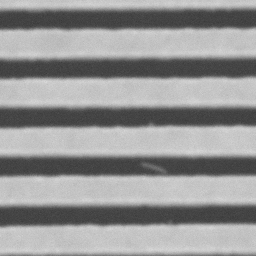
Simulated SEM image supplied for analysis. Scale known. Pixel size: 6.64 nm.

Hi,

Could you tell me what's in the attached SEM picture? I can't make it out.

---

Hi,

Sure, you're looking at lines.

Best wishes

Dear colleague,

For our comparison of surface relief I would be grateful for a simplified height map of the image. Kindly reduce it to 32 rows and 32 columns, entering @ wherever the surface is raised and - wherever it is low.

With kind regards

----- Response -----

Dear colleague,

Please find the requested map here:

@@@@@@@@@@@@@@@@@@@@@@@@@@@@@@@@
--------------------------------
--------------------------------
--------------------------------
@@@@@@@@@@@@@@@@@@@@@@@@@@@@@@@@
@@@@@@@@@@@@@@@@@@@@@@@@@@@@@@@@
@@@@@@@@@@@@@@@@@@@@@@@@@@@@@@@@
--------------------------------
--------------------------------
--------------------------------
@@@@@@@@@@@@@@@@@@@@@@@@@@@@@@@@
@@@@@@@@@@@@@@@@@@@@@@@@@@@@@@@@
@@@@@@@@@@@@@@@@@@@@@@@@@@@@@@@@
--------------------------------
--------------------------------
--------------------------------
@@@@@@@@@@@@@@@@@@@@@@@@@@@@@@@@
@@@@@@@@@@@@@@@@@@@@@@@@@@@@@@@@
@@@@@@@@@@@@@@@@@@@@@@@@@@@@@@@@
--------------------------------
--------------------------------
--------------------------------
@@@@@@@@@@@@@@@@@@@@@@@@@@@@@@@@
@@@@@@@@@@@@@@@@@@@@@@@@@@@@@@@@
@@@@@@@@@@@@@@@@@@@@@@@@@@@@@@@@
@@@@@@@@@@@@@@@@@@@@@@@@@@--@@@-
--------------------------------
--------------------------------
@@@@@@@@@@@@@@@@@@@@@@@@@@@@@@@@
@@@@@@@@@@@@@@@@@@@@@@@@@@@@@@@@
@@@@@@@@@@@@@@@@@@@@@@@@@@@@@@@@
@@@@@@@@@@@@@@@@@@@@@@@@@@@@@@@@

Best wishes